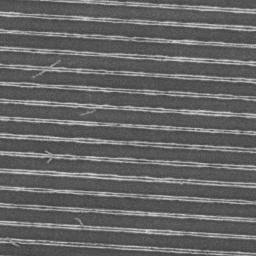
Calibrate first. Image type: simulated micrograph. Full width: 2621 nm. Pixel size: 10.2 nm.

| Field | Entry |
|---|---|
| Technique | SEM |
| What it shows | parallel lines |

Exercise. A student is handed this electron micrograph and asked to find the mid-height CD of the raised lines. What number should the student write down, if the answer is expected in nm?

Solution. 29.4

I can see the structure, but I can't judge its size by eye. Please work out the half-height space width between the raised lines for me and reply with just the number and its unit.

148 nm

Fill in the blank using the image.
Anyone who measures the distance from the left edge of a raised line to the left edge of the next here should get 178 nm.